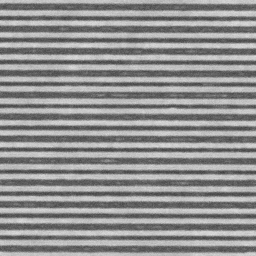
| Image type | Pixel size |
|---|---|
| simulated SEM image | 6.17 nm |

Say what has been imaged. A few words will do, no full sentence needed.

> parallel lines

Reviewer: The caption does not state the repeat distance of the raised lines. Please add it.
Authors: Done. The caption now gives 67.4 nanometers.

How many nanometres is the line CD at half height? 28.5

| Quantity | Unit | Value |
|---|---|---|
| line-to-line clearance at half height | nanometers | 40.1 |